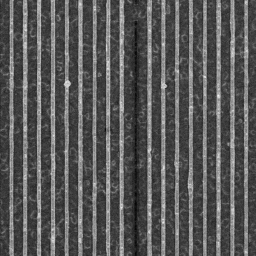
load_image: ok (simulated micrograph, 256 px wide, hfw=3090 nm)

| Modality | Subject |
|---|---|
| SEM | parallel lines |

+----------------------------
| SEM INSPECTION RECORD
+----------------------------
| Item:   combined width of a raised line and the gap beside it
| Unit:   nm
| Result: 167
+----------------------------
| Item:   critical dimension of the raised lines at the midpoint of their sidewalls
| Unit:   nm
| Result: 39.2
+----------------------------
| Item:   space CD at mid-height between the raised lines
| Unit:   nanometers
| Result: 124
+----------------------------